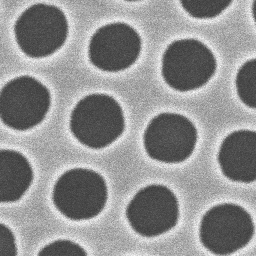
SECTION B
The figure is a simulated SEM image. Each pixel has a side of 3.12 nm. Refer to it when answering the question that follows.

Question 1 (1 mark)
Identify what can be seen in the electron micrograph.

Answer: holes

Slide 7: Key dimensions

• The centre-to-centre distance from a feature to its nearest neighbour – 0.234 microns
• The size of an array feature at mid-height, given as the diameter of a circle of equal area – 53.7 pixels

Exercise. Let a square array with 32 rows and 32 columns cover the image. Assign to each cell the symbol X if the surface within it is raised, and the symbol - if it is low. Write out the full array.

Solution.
XXXX--XXXXXXXXXXXXXXXXX------XXX
XXX-----XXXXXXXXXXXXXXX-----XXXX
XX------XXXXXXXXXXXXXXXXXXXXXXXX
XX-------XXXX----XXXXXXXXXXXXXXX
XX------XXXX-----XXXXXXXXXXXXXXX
XX------XXX-------XXX----XXXXXXX
XXX----XXXX------XXXX-----XXXXXX
XXXXXXXXXXX------XXX-------XXXX-
XXXXXXXXXXXX----XXXX-------XXX--
XXXXXXXXXXXXXXXXXXXX-------XXX--
X----XXXXXXXXXXXXXXXX-----XXX---
------XXXXXXXXXXXXXXXXXXXXXXXX--
------XXXX----XXXXXXXXXXXXXXXX--
------XXX------XXXXXXXXXXXXXXXX-
------XXX------XXXXX---XXXXXXXXX
X----XXXX-------XXX-----XXXXXXXX
XXXXXXXXX------XXX-------XXXX---
XXXXXXXXXX----XXXX-------XXX----
XXXXXXXXXXX--XXXXX------XXX-----
---XXXXXXXXXXXXXXXX-----XXX-----
----XXXXXXXXXXXXXXXXXXXXXXX-----
----XXXX----XXXXXXXXXXXXXXXX----
----XXX------XXXXXXXXXXXXXXXX---
----XXX------XXXXX---XXXXXXXXXXX
---XXXX------XXXX-----XXXXXXXXXX
XXXXXXX------XXX------XXXXXX-XXX
XXXXXXXX-----XXX------XXXX-----X
XXXXXXXXX-XXXXXX------XXX-------
-XXXXXXXXXXXXXXXX-----XXX-------
--XXXXXXXXXXXXXXXX--XXXXX-------
--XXXX----XXXXXXXXXXXXXXX------X
--XXX------XXXXXXXXXXXXXXX---XXX